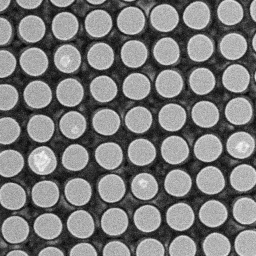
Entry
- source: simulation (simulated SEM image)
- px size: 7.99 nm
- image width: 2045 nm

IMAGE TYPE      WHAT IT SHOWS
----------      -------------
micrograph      an array of small figures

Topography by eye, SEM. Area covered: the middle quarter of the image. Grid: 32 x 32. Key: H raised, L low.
HHHHLLLHHHHLLLLLHHHLLLLLLLLLLLLL
HHHLLLLLLLLLLLLLLLLLLLLLLLLLLLLL
LLLLLLLLLLLLLLLLLHHLLLLLHHHHHLLL
LLLLLLLLHHHLLLLLHHHHHLLHHHHHHLLL
HHHHLLLHHHHHHLLHHHHHHLLHHHHHHLLH
HHHHLLLHHHHHHLLHHHHHHLLHHHHHHHLL
HHHHHLLHHHHHHLLHHHHHHLLHHHHHHLLL
HHHHHLLHHHHHHLLHHHHHHLLLHHHHLLLL
HHHHHLLLHHHHLLLLLHHHLLLLLLLLLLLL
HHHHLLLLLLLLLLLLLLLLLLLLLLLLLLLL
LHLLLLLLLLLLLLLLLLLLLLLLLHHHHLLL
LLLLLLLLLLLHLLLLLHHHHLLLHHHHHHLL
LHHHLLLLHHHHHLLLHHHHHHLLHHHHHHLL
HHHHHLLHHHHHHHLHHHHHHHLLHHHHHHLL
HHHHHLLHHHHHHHLHHHHHHHLLHHHHHHLL
HHHHHLLHHHHHHHLLHHHHHLLLHHHHHHLL
HHHHHLLLHHHHHLLLLHHHHLLLLLHHLLLL
HHHHHLLLLHHHLLLLLLLLLLLLLLLLLLLL
LLHLLLLLLLLLLLLLLLLLLLLLLLHHHLLL
LLLLLLLLLLLLLLLLLHHHHLLLLHHHHHLL
LHHHLLLLLHHHHHLLHHHHHHLLLHHHHHHL
HHHHHLLLHHHHHHLLHHHHHHHLHHHHHHHL
HHHHHHLLHHHHHHLLHHHHHHHLLHHHHHHL
HHHHHHLLHHHHHHLLHHHHHHHLLHHHHHHL
HHHHHHLLHHHHHHLLLHHHHLLLLLHHHLLL
HHHHHLLLLHHHHLLLLLLLLLLLLLLLLLLL
LLLLLLLLLLLLLLLLLLLLLLLLLLLLLLLL
LLLLLLLLLLLLLLLLLLLLHLLLLLHHHHHL
LLLLLLLLLLHHHHLLLLHHHHLLLHHHHHHL
LHHHHHLLLHHHHHHLLHHHHHHLLHHHHHHH
LHHHHHLLLHHHHHHLLHHHHHHLLHHHHHHH
HHHHHHHLLHHHHHHLLHHHHHHLLHHHHHHL